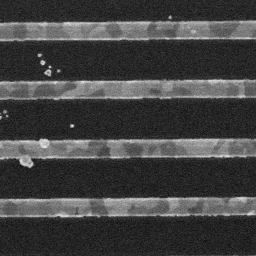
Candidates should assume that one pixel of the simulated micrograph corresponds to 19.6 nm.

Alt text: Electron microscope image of lines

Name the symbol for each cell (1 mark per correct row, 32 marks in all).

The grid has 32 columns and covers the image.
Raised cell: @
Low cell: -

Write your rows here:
--------------------------------
--------------------------------
--------------------------------
@@@@@@@@@@@@@@@@@@@@@@@@@@@@@@@@
@@@@@@@@@@@@@@@@@@@@@@@@@@@@@@@@
--------------------------------
--------------------------------
--------------------------------
--------------------------------
--------------------------------
@@@@@@@@@@@@@@@@@@@@@@@@@@@@@@@@
@@@@@@@@@@@@@@@@@@@@@@@@@@@@@@@@
--------------------------------
--------------------------------
--------------------------------
--------------------------------
--------------------------------
-----@--------------------------
@@@@@@@@@@@@@@@@@@@@@@@@@@@@@@@@
@@@@@@@@@@@@@@@@@@@@@@@@@@@@@-@-
---@----------------------------
--------------------------------
--------------------------------
--------------------------------
--------------------------------
@@@@@@@@@@@@@@@@@@@@@@@@@@@@@@@@
@@@@@@@@@@@@@@@@@@@@@@@@@@@@@@@@
--------------------------------
--------------------------------
--------------------------------
--------------------------------
--------------------------------